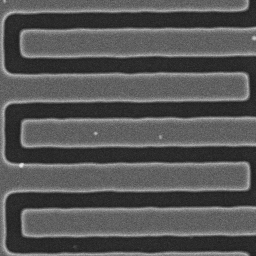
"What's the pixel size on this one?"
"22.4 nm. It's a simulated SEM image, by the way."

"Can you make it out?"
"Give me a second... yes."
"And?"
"groups of lines, slits or small figures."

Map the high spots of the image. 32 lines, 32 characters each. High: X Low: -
XXXXXXXXXXXXXXXXXXXXXXXXXXXXXXX-
XXXXXXXXXXX--XX-----------------
X-------------------------------
-------------------------------X
---XXXXXXXXXXXXXXXXXXXXXXXXXXXXX
---XXXXXXXXXXXXXXXXXXXXXXXXXXXXX
---XXXXXXXXXXXXXXXXXXXXXXXXXXXXX
--------------------------------
X-------------------------------
XXXXXXXXXXXXXXXXXXXXXXXXXXXXXXX-
XXXXXXXXXXXXXXXXXXXXXXXXXXXXXXX-
XXXXXXXXXXXXXXXXXXXXXXXXXXXXXXX-
XXXXXXXXXXXXXXXXXXXXXXXXXXXXXXX-
X-------------------------------
X-------------------------------
X--XXXXXXXXXXXXXXXXXXXXXXXXXXXXX
X--XXXXXXXXXXXXXXXXXXXXXXXXXXXXX
X--XXXXXXXXXXXXXXXXXXXXXXXXXXXXX
X-------------------------------
X-------------------------------
XXX-------XX--XXXXXXXXXXXXXXXXX-
XXXXXXXXXXXXXXXXXXXXXXXXXXXXXXX-
XXXXXXXXXXXXXXXXXXXXXXXXXXXXXXX-
XXXXXXXXXXXXXXXXXXXXXXXXXXXXXXX-
X-------------------------------
X-------------------------------
X--XXXXXXXXXXXXXXXXXXXXXXXXXXXXX
X--XXXXXXXXXXXXXXXXXXXXXXXXXXXXX
X--XXXXXXXXXXXXXXXXXXXXXXXXXXXXX
X--XXXXXXXXXXXXXXX--------------
X-------------------------------
X-------------------------------